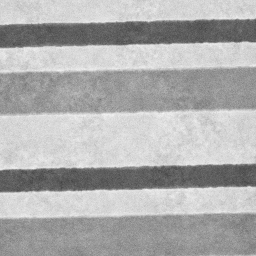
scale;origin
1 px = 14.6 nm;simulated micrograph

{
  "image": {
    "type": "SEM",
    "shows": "lines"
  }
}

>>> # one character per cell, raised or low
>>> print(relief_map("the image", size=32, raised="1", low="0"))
11111111111111111111111111111111
11111111111111111111111111111111
11111111111111111111000000000000
00000000000000000000000000000000
00000000000000000000000000000000
00000000000000000000000111111111
11111111111111111111111111111111
11111111111111111111111111111111
11111111111111111000000000000000
00000000000000000000000000000000
00000000000000000000000000000000
00000000000000000000000000000000
00000000000000000000000000000000
00000000000000000000000000000000
00111111111111111111111111111111
11111111111111111111111111111111
11111111111111111111111111111111
11111111111111111111111111111111
11111111111111111111111111111111
11111111111111111111111111111111
11111111111111111111111110000000
00000000000000000000000000000000
00000000000000000000000000000000
00000000000000000000000000111111
11111111111111111111111111111111
11111111111111111111111111111111
11111111111111111111111111111101
00000000000000000000000000000000
00000000000000000000000000000000
00000000000000000000000000000000
00000000000000000000000000000000
00000000000000000000000000000000